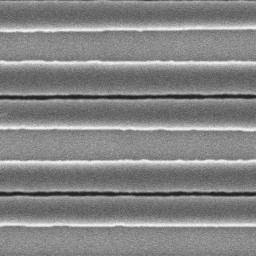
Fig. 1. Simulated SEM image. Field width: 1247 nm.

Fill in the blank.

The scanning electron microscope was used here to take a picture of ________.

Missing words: lines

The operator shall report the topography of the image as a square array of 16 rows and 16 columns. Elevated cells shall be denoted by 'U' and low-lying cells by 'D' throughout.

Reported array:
UUUUUUUUUUUUUUUU
UUUUUUUUUUUUUUUU
DDDDDDDDDDDDDDDD
DDDDDDDDDDDDDDDD
UUUUUUUUUUUUUUUU
UUUUUUUUUUUUUUUU
UUUUUUUUUUUUUUUU
UUUUUUUUUUUUUUUU
DDDDDDDDDDDDDDDD
DDDDDDDDDDDDDDDD
UUUUUUUUUUUUUUUU
UUUUUUUUUUUUUUUU
UUUUUUUUUUUUUUUU
UUUUUUUUUUUUUUUU
DDDDDDDDDDDDDDDD
DDDDDDDDDDDDDDDD